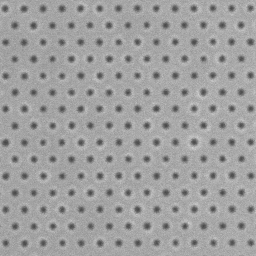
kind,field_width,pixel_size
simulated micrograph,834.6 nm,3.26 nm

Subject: a regular array of holes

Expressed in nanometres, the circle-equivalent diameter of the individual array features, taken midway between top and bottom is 21.5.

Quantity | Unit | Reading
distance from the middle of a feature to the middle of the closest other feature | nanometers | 61.1